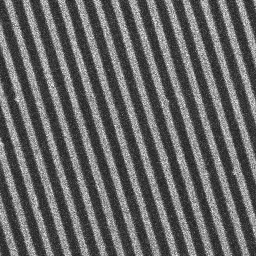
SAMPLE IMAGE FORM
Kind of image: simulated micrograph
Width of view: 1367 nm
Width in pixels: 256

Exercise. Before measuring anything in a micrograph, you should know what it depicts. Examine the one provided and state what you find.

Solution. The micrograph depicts parallel lines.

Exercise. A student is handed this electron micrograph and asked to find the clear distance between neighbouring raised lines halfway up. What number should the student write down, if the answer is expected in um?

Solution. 0.0504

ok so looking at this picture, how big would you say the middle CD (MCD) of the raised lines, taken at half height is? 40.8 nm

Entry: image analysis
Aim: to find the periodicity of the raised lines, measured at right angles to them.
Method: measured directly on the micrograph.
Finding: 90.7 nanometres